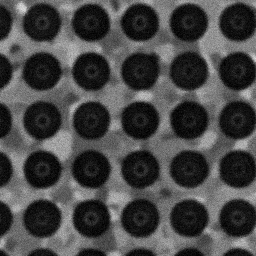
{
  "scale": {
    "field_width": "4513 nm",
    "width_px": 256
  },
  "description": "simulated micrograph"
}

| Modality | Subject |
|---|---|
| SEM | an array of small figures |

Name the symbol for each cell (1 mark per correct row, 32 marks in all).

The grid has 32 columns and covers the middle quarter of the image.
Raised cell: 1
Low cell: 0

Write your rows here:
11000000000011000000000011000000
11000011000011000011000011000011
11000011000011000011000011000011
11000000000111000000000011100000
11000000000111100000000111100000
11100000001111110000001111110000
11111000011111111000011111111000
11111111111111111111111111111111
11111111111111111111111111111111
11111000011111111000011111111000
11100000001111110000000111110000
11100000000111100000000111100000
11000000000111000000000011100000
11000011000011000011000011000011
11000111000011000011000011000011
11000010000011000000000011000001
11000000000111100000000011100000
11100000000111100000000111110000
11111000011111111000001111111000
11111111111111111111111111111111
11111111111111111111111111111111
11111101111111111100111111111100
11110000001111110000001111110000
11100000000111100000000111100000
11000000000111100000000011100000
11000011000011000011000011000011
11000011000011000011000011000011
11000011000011000011000011100011
11000000000111100000000011100000
11100000000111100000000111100000
11110000001111110000001111110000
11111111111111111111111111111111